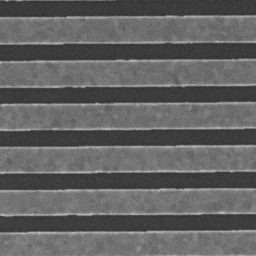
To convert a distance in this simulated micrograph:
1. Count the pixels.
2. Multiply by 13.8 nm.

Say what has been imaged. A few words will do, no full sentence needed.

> lines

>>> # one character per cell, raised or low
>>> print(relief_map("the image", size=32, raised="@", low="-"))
--------------------------------
--------------------------------
@@@@@@@@@@@@@@@@@@@@@@@@@@@@@@@@
@@@@@@@@@@@@@@@@@@@@@@@@@@@@@@@@
@@@@@@@@@@@@@@@@@@@@@@@@@@@@@@@@
--------------------------------
--------------------------------
------------------------------@@
@@@@@@@@@@@@@@@@@@@@@@@@@@@@@@@@
@@@@@@@@@@@@@@@@@@@@@@@@@@@@@@@@
@@@@@@@@@@@@@@@@@@@@@@@@@@@@@@@@
--------------------------------
--------------------------------
@@@@@@@@@@@@@@@@@@@@@@@@@@@@@@@@
@@@@@@@@@@@@@@@@@@@@@@@@@@@@@@@@
@@@@@@@@@@@@@@@@@@@@@@@@@@@@@@@@
--------------------------------
--------------------------------
@@@@@@@@@@@@@@@@@@@@@@@@@@@@@@@@
@@@@@@@@@@@@@@@@@@@@@@@@@@@@@@@@
@@@@@@@@@@@@@@@@@@@@@@@@@@@@@@@@
@@@@@@@@@@@@--------------------
--------------------------------
--------------------------------
@@@@@@@@@@@@@@@@@@@@@@@@@@@@@@@@
@@@@@@@@@@@@@@@@@@@@@@@@@@@@@@@@
@@@@@@@@@@@@@@@@@@@@@@@@@@@@@@@@
--------------------------------
--------------------------------
@@@@@@@@@@@@@@@@@@@@@@@@@@@@@@@@
@@@@@@@@@@@@@@@@@@@@@@@@@@@@@@@@
@@@@@@@@@@@@@@@@@@@@@@@@@@@@@@@@